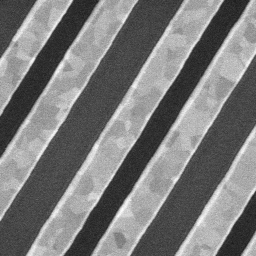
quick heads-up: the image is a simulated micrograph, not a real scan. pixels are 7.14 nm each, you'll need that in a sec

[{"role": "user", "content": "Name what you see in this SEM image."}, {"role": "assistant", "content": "lines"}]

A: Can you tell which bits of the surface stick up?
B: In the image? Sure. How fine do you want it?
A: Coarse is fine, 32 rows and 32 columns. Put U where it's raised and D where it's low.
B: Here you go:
DDDDUUUUUDDDUUUUUDDDDDDUUUUUDDDU
DDDDUUUUDDDDUUUUDDDDDDUUUUUDDDUU
DDDUUUUUDDDUUUUUDDDDDUUUUUDDDDUU
DDDUUUUDDDUUUUUDDDDDDUUUUUDDDUUU
DDUUUUDDDDUUUUUDDDDDUUUUUDDDUUUU
DUUUUUDDDUUUUUDDDDDDUUUUUDDDUUUU
DUUUUDDDUUUUUDDDDDDUUUUUDDDUUUUU
UUUUDDDDUUUUUDDDDDUUUUUDDDDUUUUD
UUUUDDDUUUUUDDDDDDUUUUUDDDUUUUUD
UUUDDDDUUUUDDDDDDUUUUUDDDUUUUUDD
UUUDDDUUUUUDDDDDDUUUUDDDDUUUUUDD
UUDDDUUUUUDDDDDDUUUUUDDDUUUUUDDD
UDDDDUUUUUDDDDDUUUUUDDDUUUUUDDDD
UDDDUUUUUDDDDDDUUUUUDDDUUUUUDDDD
DDDUUUUUDDDDDDUUUUUDDDUUUUUDDDDD
DDDUUUUUDDDDDUUUUUDDDDUUUUDDDDDD
DDUUUUUDDDDDDUUUUUDDDUUUUUDDDDDU
DUUUUUDDDDDDUUUUUDDDUUUUUDDDDDDU
DUUUUUDDDDDDUUUUDDDDUUUUUDDDDDUU
UUUUUDDDDDDUUUUUDDDUUUUUDDDDDDUU
UUUUUDDDDDUUUUUDDDUUUUUDDDDDDUUU
UUUUDDDDDDUUUUUDDDUUUUUDDDDDUUUU
UUUDDDDDDUUUUUDDDUUUUUDDDDDDUUUU
UUUDDDDDUUUUUDDDDUUUUUDDDDDUUUUU
UUDDDDDDUUUUUDDDUUUUUDDDDDDUUUUD
UDDDDDDUUUUUDDDUUUUUDDDDDDUUUUUD
UDDDDDDUUUUDDDDUUUUUDDDDDUUUUUDD
DDDDDDUUUUUDDDUUUUUDDDDDDUUUUUDD
DDDDDUUUUUDDDUUUUUDDDDDDUUUUUDDD
DDDDDUUUUUDDDUUUUUDDDDDUUUUUDDDD
DDDDUUUUUDDDUUUUUDDDDDDUUUUUDDDU
DDDDUUUUDDDDUUUUUDDDDDUUUUUDDDUU